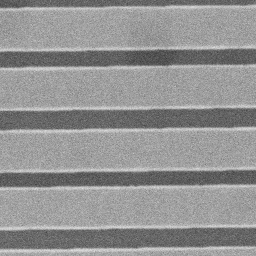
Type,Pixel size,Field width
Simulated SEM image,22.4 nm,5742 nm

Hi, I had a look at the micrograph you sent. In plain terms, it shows lines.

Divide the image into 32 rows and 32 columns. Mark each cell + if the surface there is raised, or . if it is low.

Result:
................................
++++++++++++++++++++++++++++++++
++++++++++++++++++++++++++++++++
++++++++++++++++++++++++++++++++
++++++++++++++++++++++++++++++++
++++++++++++++++++++++++++++++++
................................
................................
.......+++++++++++++++++++++++++
++++++++++++++++++++++++++++++++
++++++++++++++++++++++++++++++++
++++++++++++++++++++++++++++++++
++++++++++++++++++++++++++++++++
++++++++++++++++++++++++........
................................
................................
++++++++++++++++++++++++++++++++
++++++++++++++++++++++++++++++++
++++++++++++++++++++++++++++++++
++++++++++++++++++++++++++++++++
++++++++++++++++++++++++++++++++
................................
................................
++++++++++++++++++++++++++++++++
++++++++++++++++++++++++++++++++
++++++++++++++++++++++++++++++++
++++++++++++++++++++++++++++++++
++++++++++++++++++++++++++++++++
+++++++++++++...................
................................
................................
++++++++++++++++++++++++++++++++